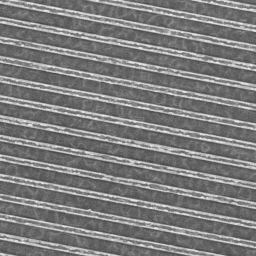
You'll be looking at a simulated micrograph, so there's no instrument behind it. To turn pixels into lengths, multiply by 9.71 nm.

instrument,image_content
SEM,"parallel lines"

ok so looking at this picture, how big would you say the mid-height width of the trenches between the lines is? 130 nm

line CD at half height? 0.0573 micrometres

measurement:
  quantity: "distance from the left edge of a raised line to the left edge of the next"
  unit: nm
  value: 188